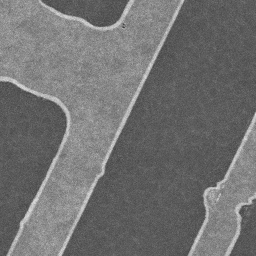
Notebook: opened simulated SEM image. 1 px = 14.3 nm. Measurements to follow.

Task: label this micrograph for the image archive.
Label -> one or a few lines or trenches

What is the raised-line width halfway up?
652 nanometres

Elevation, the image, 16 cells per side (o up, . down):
ooo.....ooo.....
ooooo..oooo.....
oooooooooo......
oooooooooo......
ooooooooo.......
..ooooooo.......
....oooo........
....oooo........
....ooo........o
....ooo........o
...ooo........oo
...ooo........oo
..ooo........ooo
..ooo........oo.
.ooo.........oo.
.ooo........oo..